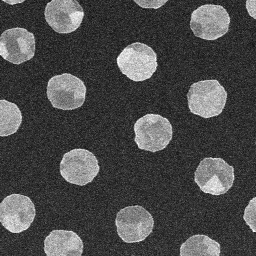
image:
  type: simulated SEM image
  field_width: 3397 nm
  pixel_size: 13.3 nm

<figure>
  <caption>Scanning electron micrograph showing a regular array of raised bodies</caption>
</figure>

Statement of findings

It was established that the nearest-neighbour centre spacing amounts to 1.01 um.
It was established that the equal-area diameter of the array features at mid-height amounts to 498 nanometers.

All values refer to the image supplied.